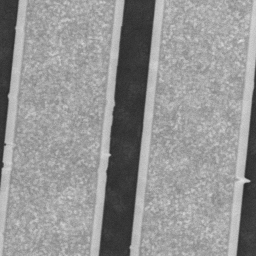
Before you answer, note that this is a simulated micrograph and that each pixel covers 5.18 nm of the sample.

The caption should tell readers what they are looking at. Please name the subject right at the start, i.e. one or a few lines or trenches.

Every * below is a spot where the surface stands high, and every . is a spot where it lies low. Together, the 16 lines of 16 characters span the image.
.******...******
.******...******
.******...******
.******...******
.******...******
.******..*******
.******..******.
.******..******.
.******..******.
.******..******.
******...******.
******...******.
******...******.
******...******.
******...******.
******..*******.